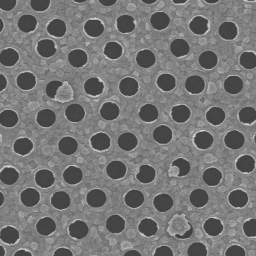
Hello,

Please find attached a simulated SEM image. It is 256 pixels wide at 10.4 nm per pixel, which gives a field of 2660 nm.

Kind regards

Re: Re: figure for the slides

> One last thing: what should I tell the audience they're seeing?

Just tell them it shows a regular array of holes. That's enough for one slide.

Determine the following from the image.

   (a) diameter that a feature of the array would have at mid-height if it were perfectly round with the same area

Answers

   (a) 194 nm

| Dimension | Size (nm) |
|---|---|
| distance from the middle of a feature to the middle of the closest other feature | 302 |